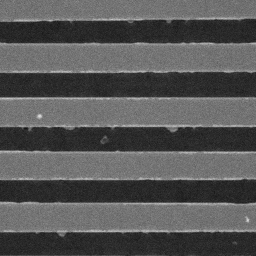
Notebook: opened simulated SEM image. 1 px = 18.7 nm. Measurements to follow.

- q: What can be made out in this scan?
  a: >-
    lines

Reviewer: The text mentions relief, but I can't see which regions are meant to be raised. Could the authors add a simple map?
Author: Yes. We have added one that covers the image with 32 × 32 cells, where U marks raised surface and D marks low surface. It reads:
UUUUUUUUUUUUUUUUUUUUUUUUUUUUUUUU
UUUUUUUUUUUUUUUUUUUUUUUUUUUUUUUU
UUUUUUUDDDDDDDDDDDDDDDDDDDDDDDDD
DDDDDDDDDDDDDDDDDDDDDDDDDDDDDDDD
DDDDDDDDDDDDDDDDDDDDDDDDDDDDDDDD
UDDDDDDDDDUUUDDDUUUDDDUUUUUDDDDU
UUUUUUUUUUUUUUUUUUUUUUUUUUUUUUUU
UUUUUUUUUUUUUUUUUUUUUUUUUUUUUUUU
UUUUUUUUUUUUUUUUUUUUUUUUUUUUUUUU
DDDDDDDDDDDDDDDDDDDDDDDDDDDDDDDD
DDDDDDDDDDDDDDDDDDDDDDDDDDDDDDDD
DDDDDDDDDDDDDDDDDDDDDDDDDDDDDDDD
UUUUUUUUUUUUUUUUUUUUUUUUUUUUUUUU
UUUUUUUUUUUUUUUUUUUUUUUUUUUUUUUU
UUUUUUUUUUUUUUUUUUUUUUUUUUUUUUUU
UUUUUUUUUUUUUUUUUUUUUUUUUUUUUUUU
DDDDDDDDDDDDDDDDDDDDDDDDDDDDDDDD
DDDDDDDDDDDDDDDDDDDDDDDDDDDDDDDD
DDDDDDDDDDDDDDDDDDDDDDDDDDDDDDDD
UUUUUUUUUUUUUUUUUUUUUUUUUUUUUUUU
UUUUUUUUUUUUUUUUUUUUUUUUUUUUUUUU
UUUUUUUUUUUUUUUUUUUUUUUUUUUUUUUU
DDDDDDDDDDDDDDDDDDDDDDDDDDDDDDDD
DDDDDDDDDDDDDDDDDDDDDDDDDDDDDDDD
DDDDDDDDDDDDDDDDDDDDDDDDDDDDDDDD
UUUUUUUUUUUUUUUUUUUUUUUUUUUUUUDU
UUUUUUUUUUUUUUUUUUUUUUUUUUUUUUUU
UUUUUUUUUUUUUUUUUUUUUUUUUUUUUUUU
UUUUUUUUUUUUUUUUUUUUUUUUUUUUUUUU
DDDDDDDDDDDDDDDDDDDDDDDDDDDDDDDD
DDDDDDDDDDDDDDDDDDDDDDDDDDDDDDDD
DDDDDDDDDDDDDDDDDDDDDDDDDDDDDDDD